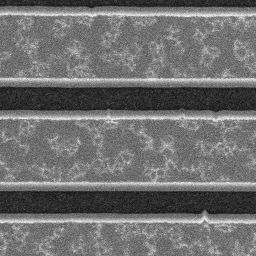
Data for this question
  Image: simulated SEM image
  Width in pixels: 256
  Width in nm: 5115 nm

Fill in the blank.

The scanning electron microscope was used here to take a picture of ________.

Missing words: one or a few lines or trenches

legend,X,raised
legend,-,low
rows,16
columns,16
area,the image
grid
----------------
XXXXXXXXXXXXXXXX
XXXXXXXXXXXXXXXX
XXXXXXXXXXXXXXXX
XXXXXXXXXXXXXXXX
----------------
----------------
XXXXXXXXXXXXXXXX
XXXXXXXXXXXXXXXX
XXXXXXXXXXXXXXXX
XXXXXXXXXXXXXXXX
XXXXXXXXXXXXXXXX
----------------
----------------
XXXXXXXXXXXXXXXX
XXXXXXXXXXXXXXXX